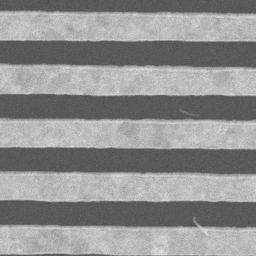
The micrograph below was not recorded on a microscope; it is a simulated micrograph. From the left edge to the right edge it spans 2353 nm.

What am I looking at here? lines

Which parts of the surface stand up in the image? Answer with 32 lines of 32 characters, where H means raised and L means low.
LLLLLLLLLLLLLLLLLLLLLLLLLLLLLLLL
LLLLLLLLLLLLLLLLLLLLLLLLLLLLLLLL
HHHHHHHHHHHHHHHHHHHHHHHHHHHHHHHH
HHHHHHHHHHHHHHHHHHHHHHHHHHHHHHHH
HHHHHHHHHHHHHHHHHHHHHHHHHHHHHHHH
LLLLLLLLLLLLLLLLLLLLLLLLLLLLLLLL
LLLLLLLLLLLLLLLLLLLLLLLLLLLLLLLL
LLLLLLLLLLLLLLLLLLLLLLLLLLLLLLLL
HHHHHHHHHHHHHHHHHHHHHLLLLLLLLLLL
HHHHHHHHHHHHHHHHHHHHHHHHHHHHHHHH
HHHHHHHHHHHHHHHHHHHHHHHHHHHHHHHH
HHHHHHHHHHHHHHHHHHHHHHHHHHHHHHHH
LLLLLLLLLLLLLLLLLLLLLLLLLLLLLLLL
LLLLLLLLLLLLLLLLLLLLLLLLLLLLLLLL
LLLLLLLLLLLLLLLLLLLLLLLLLLLLLLLL
HHHHHHHHHHHHHHHHHHHHHHHHHHHHHHHH
HHHHHHHHHHHHHHHHHHHHHHHHHHHHHHHH
HHHHHHHHHHHHHHHHHHHHHHHHHHHHHHHH
LLLLLLLLLLLLLLLLLLLLLHLLLLHHHHHH
LLLLLLLLLLLLLLLLLLLLLLLLLLLLLLLL
LLLLLLLLLLLLLLLLLLLLLLLLLLLLLLLL
LLLLLLLLLLLLLLLLLLLLLLLLLLLLLLLL
HHHHHHHHHHHHHHHHHHHHHHHHHHHHHHHH
HHHHHHHHHHHHHHHHHHHHHHHHHHHHHHHH
HHHHHHHHHHHHHHHHHHHHHHHHHHHHHHHH
LLLLLLLLLLLLLLLLLLLLLLLLLLLLLLLL
LLLLLLLLLLLLLLLLLLLLLLLLLLLLLLLL
LLLLLLLLLLLLLLLLLLLLLLLLLLLLLLLL
HHHHHHHHHHHHHHLLLLLLLLLLHLLLLLLL
HHHHHHHHHHHHHHHHHHHHHHHHHHHHHHHH
HHHHHHHHHHHHHHHHHHHHHHHHHHHHHHHH
HHHHHHHHHHHHHHHHHHHHHHHHHHHHHHHH